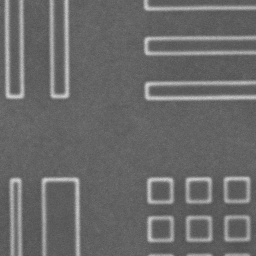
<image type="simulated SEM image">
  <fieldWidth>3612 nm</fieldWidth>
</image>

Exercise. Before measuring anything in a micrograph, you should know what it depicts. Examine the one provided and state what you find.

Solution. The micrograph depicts groups of lines, slits or small figures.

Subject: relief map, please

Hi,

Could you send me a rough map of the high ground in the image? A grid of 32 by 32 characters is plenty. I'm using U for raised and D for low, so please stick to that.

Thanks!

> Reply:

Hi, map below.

DUUDDDUUDDDDDDDDDDUUUUUUUUUUUUUU
DUUDDDUUDDDDDDDDDDDDDDDDDDDDDDDD
DUUDDDUUDDDDDDDDDDDDDDDDDDDDDDDD
DUUDDDUUDDDDDDDDDDDDDDDDDDDDDDDD
DUUDDDUUDDDDDDDDDDDDDDDDDDDDDDDD
DUUDDDUUDDDDDDDDDDUUUUUUUUUUUUUU
DUUDDDUUDDDDDDDDDDDUUUUUUUUUUUUU
DUUDDDUUDDDDDDDDDDDDDDDDDDDDDDDD
DUUDDDUUDDDDDDDDDDDDDDDDDDDDDDDD
DUUDDDUUDDDDDDDDDDDDDDDDDDDDDDDD
DUUDDDUUDDDDDDDDDDDUUUUUUUUUUUUU
DUUDDDUUDDDDDDDDDDUUUUUUUUUUUUUU
DDDDDDDDDDDDDDDDDDDDDDDDDDDDDDDD
DDDDDDDDDDDDDDDDDDDDDDDDDDDDDDDD
DDDDDDDDDDDDDDDDDDDDDDDDDDDDDDDD
DDDDDDDDDDDDDDDDDDDDDDDDDDDDDDDD
DDDDDDDDDDDDDDDDDDDDDDDDDDDDDDDD
DDDDDDDDDDDDDDDDDDDDDDDDDDDDDDDD
DDDDDDDDDDDDDDDDDDDDDDDDDDDDDDDD
DDDDDDDDDDDDDDDDDDDDDDDDDDDDDDDD
DDDDDDDDDDDDDDDDDDDDDDDDDDDDDDDD
DDDDDDDDDDDDDDDDDDDDDDDDDDDDDDDD
DDDDDDUUUDDDDDDDDDDUUDDDUUDDUUUD
DUDDDUUUUUDDDDDDDDDUUDDUUUDDUUUD
DDDDDUUUUUDDDDDDDDDUUDDUUUDDUUUD
DDDDDUUUUUDDDDDDDDDDDDDDDDDDDDDD
DDDDDDUUUUDDDDDDDDDDDDDDDDDDDDDD
DDDDDDUUUUDDDDDDDDDUUDDDUUDDUUUD
DDDDDDUUUUDDDDDDDDDUUUDUUUDDUUUD
DDDDDDUUUUDDDDDDDDDUUUDDUUDDUUUD
DDDDDDUUUUDDDDDDDDDDDDDDDDDDDDDD
DDDDDDUUUUDDDDDDDDDDDDDDDDDDDDDD